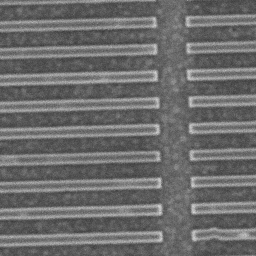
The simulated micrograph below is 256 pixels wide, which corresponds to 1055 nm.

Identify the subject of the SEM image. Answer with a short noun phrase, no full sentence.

parallel lines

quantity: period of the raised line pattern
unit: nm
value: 110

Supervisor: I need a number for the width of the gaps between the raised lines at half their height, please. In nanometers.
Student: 72.6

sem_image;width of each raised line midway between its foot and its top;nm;38.1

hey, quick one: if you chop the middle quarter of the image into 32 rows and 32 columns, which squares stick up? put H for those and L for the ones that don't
LLLLLLLLLLLLLLLLLLLLLLLLLLLLLLLL
LLLLLLLLLLLLLLLLLLLLLLLLLLLLLLLL
LLLLLHHHHHHHHHHHHHHHHHHLLLLLLLLH
HHHHHHHHHHHHHHHHHHHHHHHLLLLLLLLH
HHHHHHHHLLLLLLLLLLLLLLLLLLLLLLLL
LLLLLLLLLLLLLLLLLLLLLLLLLLLLLLLL
LLLLLLLLLLLLLLLLLLLLLLLLLLLLLLLL
LLLLLLLLLLLLLLLLLLLLLLLLLLLLLLLL
LLLLLLLLLLLLLLLLLLLLLLLLLLLLLLLL
HHHHHHHHHHHHHHHHHHHHHHHLLLLLLLLL
HHHHHHHHHHHHHHHHHHHHHHHHLLLLLLLL
LLLLLLLLLLLLLLLLLLLLLLLLLLLLLLLL
LLLLLLLLLLLLLLLLLLLLLLLLLLLLLLLL
LLLLLLLLLLLLLLLLLLLLLLLLLLLLLLLL
LLLLLLLLLLLLLLLLLLLLLLLLLLLLLLLL
LLLLLLLLLLLLLLLHHHHHHHHLLLLLLLLH
HHHHHHHHHHHHHHHHHHHHHHHLLLLLLLLL
HHHHHHHHHHHHHHHHHHHHHHLLLLLLLLLL
LLLLLLLLLLLLLLLLLLLLLLLLLLLLLLLL
LLLLLLLLLLLLLLLLLLLLLLLLLLLLLLLL
LLLLLLLLLLLLLLLLLLLLLLLLLLLLLLLL
LLLLLLLLLLLLLLLLLLLLLLLLLLLLLLLL
LLLLLHHHHHHHHHHHHHHHHHHHLLLLLLLL
HHHHHHHHHHHHHHHHHHHHHHHHLLLLLLLL
HHHHHHHHHLLLLLLLLLLLLLLLLLLLLLLL
LLLLLLLLLLLLLLLLLLLLLLLLLLLLLLLL
LLLLLLLLLLLLLLLLLLLLLLLLLLLLLLLL
LLLLLLLLLLLLLLLLLLLLLLLLLLLLLLLL
LLLLLLLLLLLLLLLLLLLLLLLLLLLLLLLL
HHHHHHHHHHHHHHHHHHHHHHHHLLLLLLLL
HHHHHHHHHHHHHHHHHHHHHHHHLLLLLLLL
LLLLLLLLLLLLLLLLLLLLLLLLLLLLLLLL